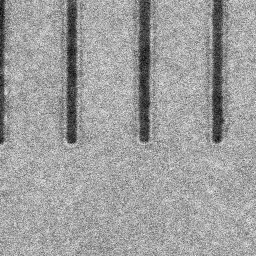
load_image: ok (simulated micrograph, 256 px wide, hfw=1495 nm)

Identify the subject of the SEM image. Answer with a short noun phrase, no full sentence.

one or a few lines or trenches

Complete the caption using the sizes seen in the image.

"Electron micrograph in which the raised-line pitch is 425 nanometres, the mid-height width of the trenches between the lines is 347 nanometers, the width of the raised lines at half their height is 79.6 nm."